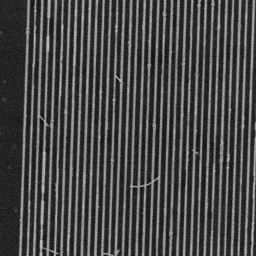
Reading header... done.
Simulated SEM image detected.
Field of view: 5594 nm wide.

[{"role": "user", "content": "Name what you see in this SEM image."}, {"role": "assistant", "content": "parallel lines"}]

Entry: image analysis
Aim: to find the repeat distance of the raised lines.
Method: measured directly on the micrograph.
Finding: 0.149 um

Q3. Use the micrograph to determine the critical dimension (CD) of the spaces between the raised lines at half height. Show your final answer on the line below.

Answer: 112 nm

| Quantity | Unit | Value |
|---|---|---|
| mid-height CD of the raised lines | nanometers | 40.9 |